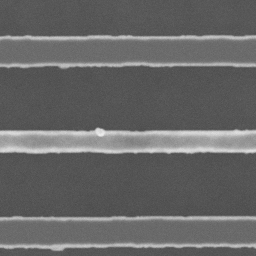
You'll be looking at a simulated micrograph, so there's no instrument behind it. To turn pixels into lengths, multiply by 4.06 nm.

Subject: lines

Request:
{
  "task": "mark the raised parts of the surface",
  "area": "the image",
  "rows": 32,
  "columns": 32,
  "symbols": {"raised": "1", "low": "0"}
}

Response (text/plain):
00000000000000000000000000000000
00000000000000000000000000000000
00000000000000000000000000000000
00000000000000000000000000000000
00000000000000000000000000111001
11111111111111111111111111111111
11111111111111111111111111111111
11111111111111111111111111111111
00000000000000000000000000000000
00000000000000000000000000000000
00000000000000000000000000000000
00000000000000000000000000000000
00000000000000000000000000000000
00000000000000000000000000000000
00000000000000000000000000000000
00000000000000000000000000000000
11111101111111111011111111111111
11111111111111111111111111111111
11111111111111111111111111111111
00000000000000000000000000000000
00000000000000000000000000000000
00000000000000000000000000000000
00000000000000000000000000000000
00000000000000000000000000000000
00000000000000000000000000000000
00000000000000000000000000000000
00000000000000000000000000000000
11111111111111111111111111111111
11111111111111111111111111111111
11111111111111111111111111111111
11111111111111111111111111111111
00000000000000000000000000000000